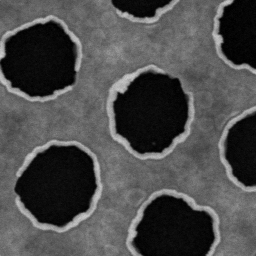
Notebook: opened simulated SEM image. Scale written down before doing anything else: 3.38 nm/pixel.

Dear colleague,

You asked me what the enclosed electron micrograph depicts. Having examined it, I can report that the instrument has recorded holes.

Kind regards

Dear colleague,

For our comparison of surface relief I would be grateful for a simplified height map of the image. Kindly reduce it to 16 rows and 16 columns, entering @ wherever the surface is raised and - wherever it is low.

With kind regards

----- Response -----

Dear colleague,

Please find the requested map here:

@@@@@@@---@@@@--
@@--@@@@@@@@@@--
@---@@@@@@@@@@--
-----@@@@@@@@@--
-----@@@@@@@@@@@
@---@@@@---@@@@@
@@@@@@@-----@@@@
@@@@@@@-----@@@-
@@@@@@@@---@@@--
@@@--@@@@-@@@@--
@@----@@@@@@@@--
@-----@@@@@@@@@-
@-----@@@@-@@@@@
@@---@@@@----@@@
@@@@@@@@@----@@@
@@@@@@@@-----@@@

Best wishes